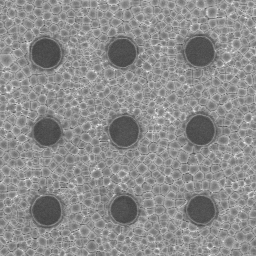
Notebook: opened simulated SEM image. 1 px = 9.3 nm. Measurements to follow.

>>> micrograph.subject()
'a regular array of raised bodies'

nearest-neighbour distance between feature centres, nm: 715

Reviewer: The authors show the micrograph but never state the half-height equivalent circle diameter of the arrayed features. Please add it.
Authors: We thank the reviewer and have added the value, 30.8 px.